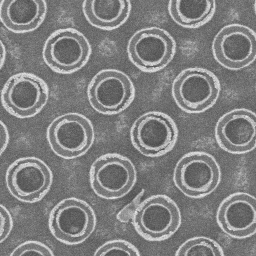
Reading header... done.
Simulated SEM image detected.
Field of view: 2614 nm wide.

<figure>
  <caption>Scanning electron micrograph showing a regular array of ring-shaped raised bodies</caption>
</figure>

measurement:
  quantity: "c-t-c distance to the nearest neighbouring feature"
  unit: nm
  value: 603